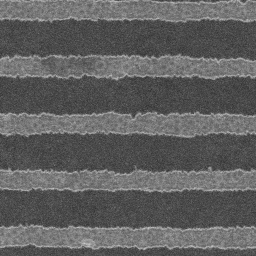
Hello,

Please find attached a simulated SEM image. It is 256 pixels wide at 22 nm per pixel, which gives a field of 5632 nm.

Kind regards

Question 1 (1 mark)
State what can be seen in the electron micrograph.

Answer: parallel lines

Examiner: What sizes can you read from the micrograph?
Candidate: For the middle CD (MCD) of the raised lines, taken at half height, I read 18.1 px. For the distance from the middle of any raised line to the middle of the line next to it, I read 1.25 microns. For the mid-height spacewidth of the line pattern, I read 850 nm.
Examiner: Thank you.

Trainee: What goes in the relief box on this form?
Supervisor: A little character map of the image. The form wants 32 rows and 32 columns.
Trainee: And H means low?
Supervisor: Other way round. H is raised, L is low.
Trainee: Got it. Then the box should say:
HHHHHHHHHHHHHHHHHHHHHHHHHHHHHHHH
HHHHHHHHHHHHHHHHHHHHHHHHHHHHHHHH
LLLLLHLLLLLLLLLLLLLLLHHLLLLLLLHH
LLLLLLLLLLLLLLLLLLLLLLLLLLLLLLLL
LLLLLLLLLLLLLLLLLLLLLLLLLLLLLLLL
LLLLLLLLLLLLLLLLLLLLLLLLLLLLLLLL
LLLLLLLLLLLLLLLLLLLLLLLLLLLLLLLL
HHHHHHHHHHHHHHHHHHHHHHHHHHHLHHHL
HHHHHHHHHHHHHHHHHHHHHHHHHHHHHHHH
LHHLHHLHHHLHHHHLLLLHLLLHLHHHLLLH
LLLLLLLLLLLLLLLLLLLLLLLLLLLLLLLL
LLLLLLLLLLLLLLLLLLLLLLLLLLLLLLLL
LLLLLLLLLLLLLLLLLLLLLLLLLLLLLLLL
LLLLLLLLLLLLLLLLLLLLLLLLLLLLLLLL
HHHHHHHLHHHHHHHHLHHHHHHHHHHHHHLL
HHHHHHHHHHHHHHHHHHHHHHHHHHHHHHHH
HHHHHHLHLHHHLHHHHHHHHHHHHHHHHHHH
LLLLLLLLLLLLLLLLLLLLLLLLLLLLLLLL
LLLLLLLLLLLLLLLLLLLLLLLLLLLLLLLL
LLLLLLLLLLLLLLLLLLLLLLLLLLLLLLLL
LLLLLLLLLLLLLLLLLLLLLLLLLLLLLLLL
HHHHHHHLLLHHHHLLLHLLLLLLLHHLHHHH
HHHHHHHHHHHHHHHHHHHHHHHHHHHHHHHH
LHHHHHHHHHHHHHHHHHHHHHHHHHHHHHHH
LLLLLLLLLLLLLLLLLLLLLLLLLLLLLLLL
LLLLLLLLLLLLLLLLLLLLLLLLLLLLLLLL
LLLLLLLLLLLLLLLLLLLLLLLLLLLLLLLL
LLLLLLLLLLLLLLLLLLLLLLLLLLLLLLLL
LHHHHHHLLHHLLLLLLLLHLLLLLLLLLLLH
HHHHHHHHHHHHHHHHHHHHHHHHHHHHHHHH
HHHHHHHHHHHHHHHHHHHHHHHHHHHHHHHH
LLLLLLLLLLLLLLLLLLLLLLLLLLLLLLLL